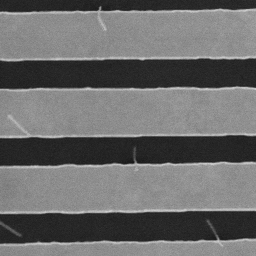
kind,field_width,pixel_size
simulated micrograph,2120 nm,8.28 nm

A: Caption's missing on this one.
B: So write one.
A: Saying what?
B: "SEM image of lines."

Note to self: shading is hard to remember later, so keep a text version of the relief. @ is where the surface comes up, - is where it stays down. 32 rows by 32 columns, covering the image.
--------------------------------
-----@@@@@@@@@@@@@@@@@@@@@@@@@@@
@@@@@@@@@@@@@@@@@@@@@@@@@@@@@@@@
@@@@@@@@@@@@@@@@@@@@@@@@@@@@@@@@
@@@@@@@@@@@@@@@@@@@@@@@@@@@@@@@@
@@@@@@@@@@@@@@@@@@@@@@@@@@@@@@@@
@@@@@@@@@@@@@@@@@@@@@@@@@@@@@@@@
@@@-----------------------------
--------------------------------
--------------------------------
--------------------------------
@@@@@@@@@@@@@@@@@@@@@@@@@@@@@@@@
@@@@@@@@@@@@@@@@@@@@@@@@@@@@@@@@
@@@@@@@@@@@@@@@@@@@@@@@@@@@@@@@@
@@@@@@@@@@@@@@@@@@@@@@@@@@@@@@@@
@@@@@@@@@@@@@@@@@@@@@@@@@@@@@@@@
@@@@@@@@@@@@@@@@@@@@@@@@@@@@@@@@
--------------------------------
--------------------------------
--------------------------------
----------------@@--@@-@@@@@@@@@
@@@@@@@@@@@@@@@@@@@@@@@@@@@@@@@@
@@@@@@@@@@@@@@@@@@@@@@@@@@@@@@@@
@@@@@@@@@@@@@@@@@@@@@@@@@@@@@@@@
@@@@@@@@@@@@@@@@@@@@@@@@@@@@@@@@
@@@@@@@@@@@@@@@@@@@@@@@@@@@@@@@@
@@@@@@@@@@@@@@@@@@--------------
--------------------------------
--------------------------------
--------------------------------
---@@@@@@@@@@@@@@@@@@@@@@@@@@@@@
@@@@@@@@@@@@@@@@@@@@@@@@@@@@@@@@